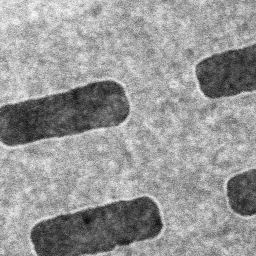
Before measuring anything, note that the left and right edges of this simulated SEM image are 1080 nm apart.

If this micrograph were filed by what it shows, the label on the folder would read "holes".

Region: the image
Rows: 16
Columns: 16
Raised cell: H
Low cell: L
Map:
HHHHHHHHHHHHHHHH
HHHHHHHHHHHHHHHH
HHHHHHHHHHHHHHHH
HHHHHHHHHHHHHLLL
HHHHHHHHHHHHLLLL
HHHHHLLLHHHHLLLL
LLLLLLLLHHHHHHHH
LLLLLLLLHHHHHHHH
LLLLHHHHHHHHHHHH
HHHHHHHHHHHHHHHH
HHHHHHHHHHHHHHHH
HHHHHHHHHHHHHHLL
HHHHHHHHLLHHHHLL
HHHLLLLLLLHHHHHL
HHLLLLLLLLHHHHHH
HHLLLLLHHHHHHHHH